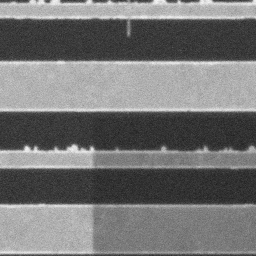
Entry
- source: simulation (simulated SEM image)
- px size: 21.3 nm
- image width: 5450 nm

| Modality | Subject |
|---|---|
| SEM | lines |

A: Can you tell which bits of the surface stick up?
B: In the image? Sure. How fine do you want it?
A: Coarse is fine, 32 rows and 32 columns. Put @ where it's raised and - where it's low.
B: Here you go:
@@@@@@@@@@@@@@@@@@@@@@@@@@@@@@@@
@@@@@@@@@@@@@@@@@@@@@@@@@@@@@@@@
--------------------------------
--------------------------------
--------------------------------
--------------------------------
--------------------------------
--------------------------------
@@@@@@@@@@@@@@@@@@@@@@@@@@@@@@@@
@@@@@@@@@@@@@@@@@@@@@@@@@@@@@@@@
@@@@@@@@@@@@@@@@@@@@@@@@@@@@@@@@
@@@@@@@@@@@@@@@@@@@@@@@@@@@@@@@@
@@@@@@@@@@@@@@@@@@@@@@@@@@@@@@@@
@@@@@@@@@@@@@@@@@@@@@@@@@@@@@@@@
--------------------------------
--------------------------------
--------------------------------
--------------------------------
--------------------------------
@@@@@@@@@@@@@@@@@@@@@@@@@@@@@@@@
@@@@@@@@@@@@@@@@@@@@@@@@@@@@@@@@
--------------------------------
--------------------------------
--------------------------------
--------------------------------
--------------------------------
@@@@@@@@@@@@@@@@@@@@@@@@@@@@@@@@
@@@@@@@@@@@@@@@@@@@@@@@@@@@@@@@@
@@@@@@@@@@@@@@@@@@@@@@@@@@@@@@@@
@@@@@@@@@@@@@@@@@@@@@@@@@@@@@@@@
@@@@@@@@@@@@@@@@@@@@@@@@@@@@@@@@
@@@@@@@@@@@@@@@@@@@@@@@@@@@@@@@@